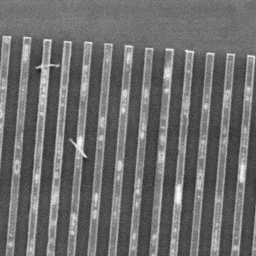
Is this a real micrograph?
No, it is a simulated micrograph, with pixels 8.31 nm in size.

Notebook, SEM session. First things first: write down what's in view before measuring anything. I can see parallel lines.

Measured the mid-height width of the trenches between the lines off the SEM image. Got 112 nm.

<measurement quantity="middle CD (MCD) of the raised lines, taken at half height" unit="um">0.059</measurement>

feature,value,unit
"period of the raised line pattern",170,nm